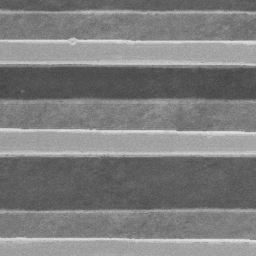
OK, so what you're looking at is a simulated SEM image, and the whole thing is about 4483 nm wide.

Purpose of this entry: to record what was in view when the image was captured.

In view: lines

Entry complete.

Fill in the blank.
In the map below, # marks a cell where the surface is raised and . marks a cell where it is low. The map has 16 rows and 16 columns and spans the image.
................
################
################
################
................
................
################
################
################
################
................
................
................
################
################
################